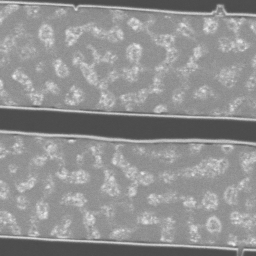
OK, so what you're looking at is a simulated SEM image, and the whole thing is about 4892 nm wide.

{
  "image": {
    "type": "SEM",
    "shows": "one or a few lines or trenches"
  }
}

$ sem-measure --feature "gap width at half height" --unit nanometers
2000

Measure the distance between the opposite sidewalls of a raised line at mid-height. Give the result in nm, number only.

482